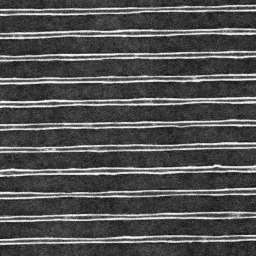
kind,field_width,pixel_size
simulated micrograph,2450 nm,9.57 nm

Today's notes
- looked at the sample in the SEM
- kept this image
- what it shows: parallel lines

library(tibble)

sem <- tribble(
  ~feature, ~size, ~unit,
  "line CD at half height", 0.0479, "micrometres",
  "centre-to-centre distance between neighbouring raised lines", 220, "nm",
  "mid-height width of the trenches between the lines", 176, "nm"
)